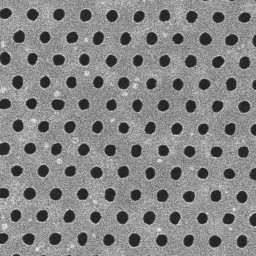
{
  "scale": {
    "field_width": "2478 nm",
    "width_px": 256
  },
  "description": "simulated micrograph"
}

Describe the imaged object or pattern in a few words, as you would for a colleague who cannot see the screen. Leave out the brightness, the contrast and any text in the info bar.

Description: a regular array of holes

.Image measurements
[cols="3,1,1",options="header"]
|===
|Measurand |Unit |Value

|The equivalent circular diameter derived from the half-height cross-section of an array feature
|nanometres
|112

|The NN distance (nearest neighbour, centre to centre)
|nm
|246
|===